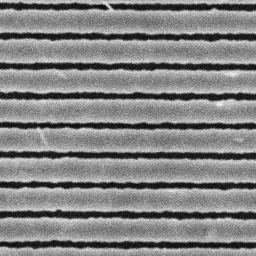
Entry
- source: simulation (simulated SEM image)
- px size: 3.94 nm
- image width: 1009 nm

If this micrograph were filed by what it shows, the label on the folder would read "parallel lines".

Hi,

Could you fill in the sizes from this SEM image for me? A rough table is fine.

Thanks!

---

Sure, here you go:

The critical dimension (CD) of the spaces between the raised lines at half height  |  26.6 nm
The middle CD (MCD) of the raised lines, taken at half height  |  92.1 nm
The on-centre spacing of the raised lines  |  117 nanometres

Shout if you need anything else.